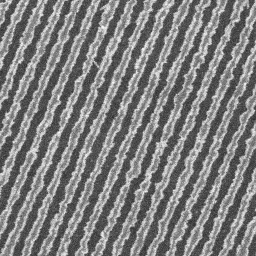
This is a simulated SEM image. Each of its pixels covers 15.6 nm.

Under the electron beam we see parallel lines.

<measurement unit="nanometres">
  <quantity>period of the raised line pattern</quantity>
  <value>260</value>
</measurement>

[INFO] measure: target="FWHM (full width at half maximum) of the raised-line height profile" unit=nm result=104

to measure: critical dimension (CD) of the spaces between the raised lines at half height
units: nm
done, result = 154